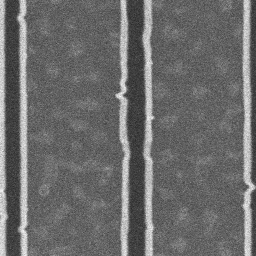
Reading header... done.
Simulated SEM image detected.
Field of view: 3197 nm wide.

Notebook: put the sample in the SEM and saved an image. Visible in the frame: one or a few lines or trenches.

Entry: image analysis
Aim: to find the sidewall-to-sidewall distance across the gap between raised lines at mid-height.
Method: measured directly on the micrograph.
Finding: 1230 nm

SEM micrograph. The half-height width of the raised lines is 23.4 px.